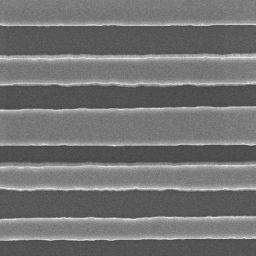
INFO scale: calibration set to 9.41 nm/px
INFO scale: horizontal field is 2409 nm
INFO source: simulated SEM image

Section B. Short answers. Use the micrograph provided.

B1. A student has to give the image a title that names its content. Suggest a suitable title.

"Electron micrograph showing lines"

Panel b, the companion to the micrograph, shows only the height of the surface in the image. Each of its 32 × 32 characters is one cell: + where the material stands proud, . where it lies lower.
++++++++++++++++++++++++++++++++
++++++++++++++++++++++++++++++++
++++++++++++++++++++++++++++++++
................................
................................
................................
................................
++++++++++++++++++++++++++++++++
++++++++++++++++++++++++++++++++
++++++++++++++++++++++++++++++++
++++.+++++...+++++++++++++++++..
................................
................................
.......................++++.++++
++++++++++++++++++++++++++++++++
++++++++++++++++++++++++++++++++
++++++++++++++++++++++++++++++++
++++++++++++++++++++++++++++++++
................................
................................
................................
++++++++++++++++++++++++++++++++
++++++++++++++++++++++++++++++++
++++++++++++++++++++++++++++++++
................................
................................
................................
++++++++++++++++++++++++++++++++
++++++++++++++++++++++++++++++++
++++++++++++++++++++++++++++++++
................................
................................